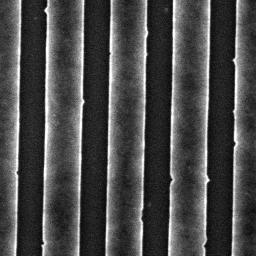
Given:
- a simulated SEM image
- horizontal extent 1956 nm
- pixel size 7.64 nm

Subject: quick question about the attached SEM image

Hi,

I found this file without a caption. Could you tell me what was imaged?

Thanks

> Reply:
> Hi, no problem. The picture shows parallel lines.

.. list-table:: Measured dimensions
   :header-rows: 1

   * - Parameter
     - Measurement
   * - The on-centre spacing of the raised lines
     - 63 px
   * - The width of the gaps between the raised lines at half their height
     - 213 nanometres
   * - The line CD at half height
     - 0.272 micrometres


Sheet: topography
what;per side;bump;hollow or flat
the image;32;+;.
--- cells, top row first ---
++....++++....++++....++++....++
++....++++....++++....++++....++
++....++++....++++....++++....++
++....++++....++++....++++....++
++....++++....++++....++++....++
++....++++....++++....++++....++
++....++++....++++....++++....++
++....++++....++++....++++...+++
++....++++....++++....++++....++
++....++++....++++....++++....++
++....++++....++++....++++...+++
++....++++....++++....++++...+++
++....++++....++++....++++...+++
++....++++....++++....++++...+++
++....++++....++++....++++...+++
++....++++....++++....++++...+++
++....++++....++++....++++...+++
++....++++....++++...+++++...+++
++....++++....++++...+++++...+++
++....++++....++++...+++++...+++
++....++++....++++...+++++...+++
++....++++....++++...+++++...+++
++....++++...+++++....++++...+++
++....++++...+++++...+++++...+++
++....++++...+++++...+++++...+++
++...+++++...+++++...+++++...+++
++...+++++...+++++...+++++...+++
++...+++++...+++++...+++++...+++
++...+++++...+++++...+++++...+++
++...+++++...+++++...+++++...+++
++...+++++...+++++...+++++...+++
++...+++++...+++++...++++....+++